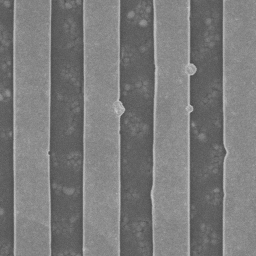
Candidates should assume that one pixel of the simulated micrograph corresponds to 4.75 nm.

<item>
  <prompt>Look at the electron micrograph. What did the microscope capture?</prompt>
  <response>one or a few lines or trenches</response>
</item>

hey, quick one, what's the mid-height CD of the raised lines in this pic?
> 170 nanometres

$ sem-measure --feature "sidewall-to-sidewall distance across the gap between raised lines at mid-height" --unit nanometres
161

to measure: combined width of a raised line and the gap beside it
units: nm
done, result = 331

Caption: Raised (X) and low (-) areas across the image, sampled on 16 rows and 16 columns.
-XX--XX---XX--XX
-XX--XX---XX--XX
-XX--XX---XX--XX
-XX--XX---XX--XX
-XX--XX---XX--XX
-XX--XX---XX--XX
-XX--XXX--XX--XX
-XX--XXX--XX--XX
-XX--XX---XX--XX
-XX--XX---XX--XX
-XX--XX---XX--XX
-XX--XX---XX--XX
-XX--XX---XX--XX
-XX--XX---XX--XX
-XX--XX---XX--XX
-XX--XX---XX--XX